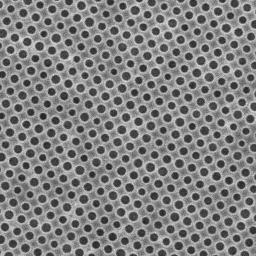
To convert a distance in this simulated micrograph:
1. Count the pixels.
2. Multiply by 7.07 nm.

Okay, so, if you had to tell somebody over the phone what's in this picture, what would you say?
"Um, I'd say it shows a regular array of holes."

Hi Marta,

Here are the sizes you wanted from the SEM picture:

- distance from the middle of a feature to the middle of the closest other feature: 91.4 nanometres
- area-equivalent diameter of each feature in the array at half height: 61 nm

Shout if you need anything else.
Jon